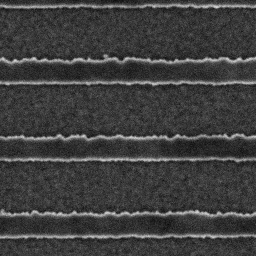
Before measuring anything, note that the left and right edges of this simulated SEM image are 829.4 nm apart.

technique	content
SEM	lines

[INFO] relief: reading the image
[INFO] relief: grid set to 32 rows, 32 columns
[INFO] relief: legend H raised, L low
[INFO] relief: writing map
HHHHHHHHHHHHHHHHHHHHHHHHHHHHHHHH
LLLLLLLLLLLLLLLLLLLLLLLLLLLLLLLL
LLLLLLLLLLLLLLLLLLLLLLLLLLLLLLLL
LLLLLLLLLLLLLLLLLLLLLLLLLLLLLLLL
LLLLLLLLLLLLLLLLLLLLLLLLLLLLLLLL
LLLLLLLLLLLLLLLLLLLLLLLLLLLLLLLL
LLLLLLLLLLLLLLLLLLLLLLLLLLLLLLLL
HLLHHHHHLHHHLHHHHHHHHLHHHHHHHHHH
HHHHHHHHHHHHHHHHHHHHHHHHHHHHHHHH
HHHHHHHHHHHHHHHHHHHHHHHHHHHHHHHH
HHLLLLLLLLLHLLLHHLLHLLLLLLHHHLLL
LLLLLLLLLLLLLLLLLLLLLLLLLLLLLLLL
LLLLLLLLLLLLLLLLLLLLLLLLLLLLLLLL
LLLLLLLLLLLLLLLLLLLLLLLLLLLLLLLL
LLLLLLLLLLLLLLLLLLLLLLLLLLLLLLLL
LLLLLLLLLLLLLLLLLLLLLLLLLLLLLLLL
LLLLLLLLLLLLLLLLLLLLLLLLLLLLLLLL
HHHHHHHHHHHHHHHHHHHHHHHHHHHHHHHH
HHHHHHHHHHHHHHHHHHHHHHHHHHHHHHHH
HHHHHHHHHHHHHHHHHHHHHHHHHHHHHHHH
LLLLLLLLLLLLLLLLLLLLLLLLLLLLLLLL
LLLLLLLLLLLLLLLLLLLLLLLLLLLLLLLL
LLLLLLLLLLLLLLLLLLLLLLLLLLLLLLLL
LLLLLLLLLLLLLLLLLLLLLLLLLLLLLLLL
LLLLLLLLLLLLLLLLLLLLLLLLLLLLLLLL
LLLLLLLLLLLLLLLLLLLLLLLLLLLLLLLL
LLLLHLLLLLLLLLLLLLLLLLLHHLLLLLLL
HHHHHHHHHHHHHHHHHHHHHHHHHHHHHHHH
HHHHHHHHHHHHHHHHHHHHHHHHHHHHHHHH
HHHHHHHHHHHHHHHHHHHHHHHHHHHHHHHH
LLLLLLLLLLLLLLLLLLLLLLLLLLLLLLLL
LLLLLLLLLLLLLLLLLLLLLLLLLLLLLLLL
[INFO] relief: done